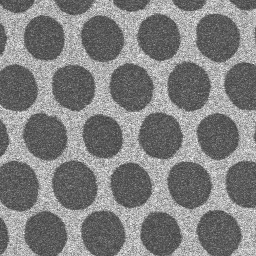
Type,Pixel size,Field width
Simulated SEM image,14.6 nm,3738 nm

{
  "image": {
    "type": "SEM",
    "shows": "a regular array of holes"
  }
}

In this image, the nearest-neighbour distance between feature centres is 826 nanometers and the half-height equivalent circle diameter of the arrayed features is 656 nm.